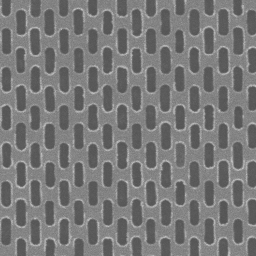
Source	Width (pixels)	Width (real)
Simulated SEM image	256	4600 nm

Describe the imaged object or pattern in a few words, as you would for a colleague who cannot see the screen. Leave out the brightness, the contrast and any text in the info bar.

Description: a regular array of holes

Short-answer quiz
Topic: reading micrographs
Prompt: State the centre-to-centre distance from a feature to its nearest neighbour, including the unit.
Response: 23.5 pixels